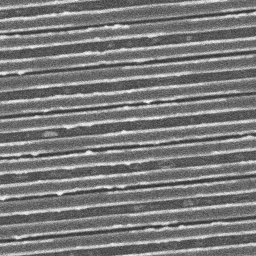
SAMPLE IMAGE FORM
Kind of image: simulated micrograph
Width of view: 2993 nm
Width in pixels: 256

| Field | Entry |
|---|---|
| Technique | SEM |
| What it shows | parallel lines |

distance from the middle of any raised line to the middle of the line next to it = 238 nm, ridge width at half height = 151 nm